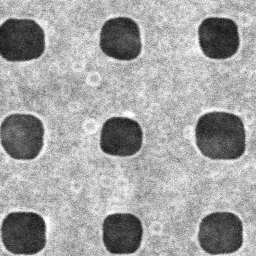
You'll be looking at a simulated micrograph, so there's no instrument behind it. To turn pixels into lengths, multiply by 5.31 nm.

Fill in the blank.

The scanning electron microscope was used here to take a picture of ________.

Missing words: holes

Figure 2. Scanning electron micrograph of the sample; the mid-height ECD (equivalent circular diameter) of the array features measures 239 nm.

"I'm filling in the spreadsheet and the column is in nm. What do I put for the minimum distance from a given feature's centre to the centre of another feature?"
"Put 518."